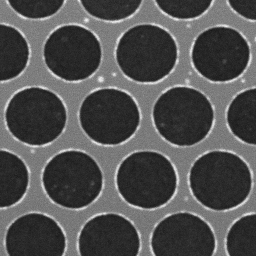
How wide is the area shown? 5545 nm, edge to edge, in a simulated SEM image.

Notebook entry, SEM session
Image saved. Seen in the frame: a regular array of holes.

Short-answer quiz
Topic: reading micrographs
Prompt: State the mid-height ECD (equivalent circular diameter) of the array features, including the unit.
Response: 1290 nm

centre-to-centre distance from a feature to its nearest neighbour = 1.58 µm